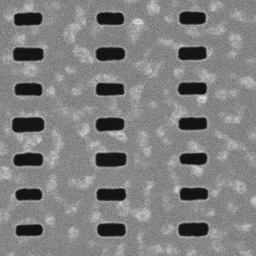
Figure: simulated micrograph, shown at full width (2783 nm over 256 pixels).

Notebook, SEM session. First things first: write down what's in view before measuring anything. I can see a regular array of holes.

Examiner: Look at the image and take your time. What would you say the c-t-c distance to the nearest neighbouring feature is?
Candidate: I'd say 0.382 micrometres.